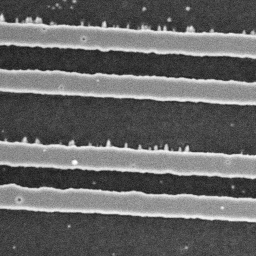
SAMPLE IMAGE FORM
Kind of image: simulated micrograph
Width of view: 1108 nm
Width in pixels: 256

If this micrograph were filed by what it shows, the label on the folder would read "lines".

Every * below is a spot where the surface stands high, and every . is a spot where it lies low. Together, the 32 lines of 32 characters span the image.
................................
................................
................................
*************...................
********************************
********************************
.................***************
................................
................................
*****************...............
********************************
.*******************************
...................*************
................................
................................
................................
................................
................................
***************.................
********************************
********************************
.................***************
................................
****.**.........................
**************************......
********************************
..........**********************
............................****
................................
................................
................................
................................